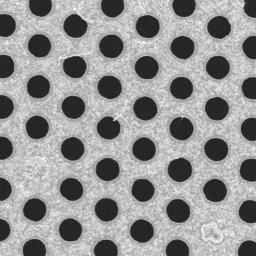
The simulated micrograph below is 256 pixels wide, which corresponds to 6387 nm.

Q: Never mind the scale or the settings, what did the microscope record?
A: a regular array of holes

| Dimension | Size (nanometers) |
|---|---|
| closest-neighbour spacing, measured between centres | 1010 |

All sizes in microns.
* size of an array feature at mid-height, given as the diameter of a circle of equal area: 0.586